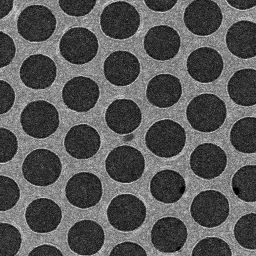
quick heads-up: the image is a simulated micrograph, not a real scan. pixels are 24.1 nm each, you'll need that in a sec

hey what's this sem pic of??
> a regular array of holes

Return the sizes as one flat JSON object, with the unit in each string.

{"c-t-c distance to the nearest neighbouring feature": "47.8 pixels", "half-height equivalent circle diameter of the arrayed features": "37.6 px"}